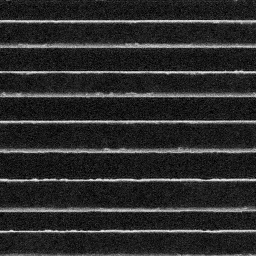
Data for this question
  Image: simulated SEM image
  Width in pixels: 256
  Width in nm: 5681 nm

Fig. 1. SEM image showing lines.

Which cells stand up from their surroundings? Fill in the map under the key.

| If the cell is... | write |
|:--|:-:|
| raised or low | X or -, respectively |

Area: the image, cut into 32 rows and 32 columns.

--------------------------------
--------------------------------
--------------------------------
XXXXXXXXXXXXXXXXXXXXXXXXXXXXXXXX
XXXXXXXXXXXXXXXXXXXXXXXXXXXXXXXX
XXXXXXXXXXXXXXXXXXXXXXXXXXXXXXXX
--------------------------------
--------------------------------
--------------------------------
XXXXXXXXXXXXXXXXXXXXXXXXXXXXXXXX
XXXXXXXXXXXXXXXXXXXXXXXXXXXXXXXX
XXXXXXXXXXXXXXXXXXXXXXXXXXXXXXXX
--------------------------------
--------------------------------
--------------------------------
XXXXXXXXXXXXXXXXXXXXXXXXXXXXXXXX
XXXXXXXXXXXXXXXXXXXXXXXXXXXXXXXX
XXXXXXXXXXXXXXXXXXXXXXXXXXXXXXXX
XXXXXXXXXXXXXXXXXXXXXXXXXXXXXXXX
--------------------------------
--------------------------------
--------------------------------
----XXX-------XX---XX-XXX----XX-
XXXXXXXXXXXXXXXXXXXXXXXXXXXXXXXX
XXXXXXXXXXXXXXXXXXXXXXXXXXXXXXXX
XXXXXXXXXXXXXXXXXXXXXXXXXXXXXXXX
--------------------------------
--------------------------------
--------------------------------
XXXXXXXXXXXXXXXXXXXXXXXXXXXXXXXX
XXXXXXXXXXXXXXXXXXXXXXXXXXXXXXXX
XXXXXXXXXXXXXXXXXXXXXXXXXXXXXXXX